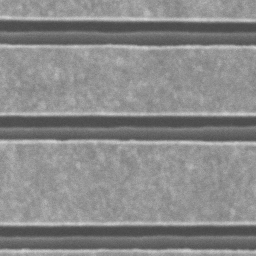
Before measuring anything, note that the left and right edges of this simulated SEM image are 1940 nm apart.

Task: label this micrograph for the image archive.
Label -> lines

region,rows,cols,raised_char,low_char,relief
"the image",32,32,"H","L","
HHHHHHHHHHHHHHHHHHHHHHHHHHHHHHHH
HHHHHHHHHHHHHHHHHHHHHHHHHHHHHHHH
LLLLLLLLLLLLLLHHHHHHHHHHHHHHHHHH
LLLLLLLLLLLLLLLLLLLLLLLLLLLLLLLL
LLLLLLLLLLLLLLLLLLLLLLLLLLLLLLLL
LLLLLLLLLLLLLLLLLLLLLLLLLLLLLLLL
HHHHHHHHHHHHHHHHHHHHHHHHHHHHHHHH
HHHHHHHHHHHHHHHHHHHHHHHHHHHHHHHH
HHHHHHHHHHHHHHHHHHHHHHHHHHHHHHHH
HHHHHHHHHHHHHHHHHHHHHHHHHHHHHHHH
HHHHHHHHHHHHHHHHHHHHHHHHHHHHHHHH
HHHHHHHHHHHHHHHHHHHHHHHHHHHHHHHH
HHHHHHHHHHHHHHHHHHHHHHHHHHHHHHHH
HHHHHHHHHHHHHHHHHHHHHHHHHHHHHHHH
LLLLLLLLLLLLLLLLLLLLLLLLLLLLLLLL
LLLLLLLLLLLLLLLLLLLLLLLLLLLLLLLL
LLLLLLLLLLLLLLLLLLLLLLLLLLLLLLLL
LLLLLLLLLLLLLLLLLLLLLLLLLLLLLLLL
HHHHHHHHHHHHHHHHHHHHHHHHHHHHHHHH
HHHHHHHHHHHHHHHHHHHHHHHHHHHHHHHH
HHHHHHHHHHHHHHHHHHHHHHHHHHHHHHHH
HHHHHHHHHHHHHHHHHHHHHHHHHHHHHHHH
HHHHHHHHHHHHHHHHHHHHHHHHHHHHHHHH
HHHHHHHHHHHHHHHHHHHHHHHHHHHHHHHH
HHHHHHHHHHHHHHHHHHHHHHHHHHHHHHHH
HHHHHHHHHHHHHHHHHHHHHHHHHHHHHHHH
HHHHHHHHHHHHHHHHHHHHHHHHHHHHHHHH
HHHHHHHHHHHHHHHHHHHHHHHHHHHHHHHH
LLLLLLLLLLLLLLLLLLLLLLLLLLLLLLLL
LLLLLLLLLLLLLLLLLLLLLLLLLLLLLLLL
LLLLLLLLLLLLLLLLLLLLLLLLLLLLLLLL
HHHHHHHHHHHHHHHHHHHHHHHHHHHHHHHH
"